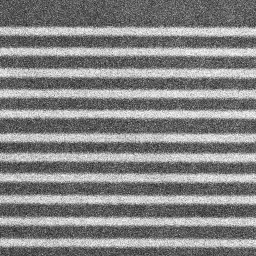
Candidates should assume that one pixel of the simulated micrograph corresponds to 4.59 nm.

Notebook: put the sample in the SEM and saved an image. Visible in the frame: parallel lines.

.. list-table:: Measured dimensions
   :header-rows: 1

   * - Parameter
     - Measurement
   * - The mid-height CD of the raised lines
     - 30.4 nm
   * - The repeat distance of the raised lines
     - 0.0971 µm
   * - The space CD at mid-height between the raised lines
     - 0.0655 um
